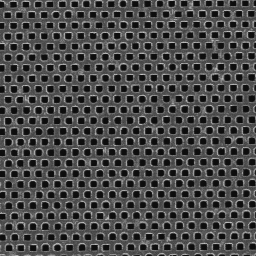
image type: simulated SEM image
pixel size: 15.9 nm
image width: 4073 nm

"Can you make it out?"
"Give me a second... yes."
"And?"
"a regular array of holes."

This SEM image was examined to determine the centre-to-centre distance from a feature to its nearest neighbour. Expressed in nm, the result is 187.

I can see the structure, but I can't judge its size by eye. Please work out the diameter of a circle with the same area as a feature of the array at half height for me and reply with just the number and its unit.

112 nm